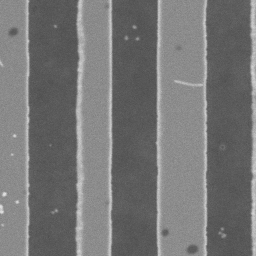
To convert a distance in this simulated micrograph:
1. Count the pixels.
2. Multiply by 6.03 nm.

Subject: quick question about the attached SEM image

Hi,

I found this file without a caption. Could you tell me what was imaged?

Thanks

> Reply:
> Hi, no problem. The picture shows lines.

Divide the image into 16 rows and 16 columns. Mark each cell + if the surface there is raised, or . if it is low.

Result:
++...++...+++...
++...++...+++...
++...++...+++...
++...++...+++...
++...++...+++...
++...++...+++...
++...++...+++...
++...++...+++...
++...++...+++...
++...++...+++...
++...++...+++...
++...++...+++...
++...++...+++...
++...++...+++...
++...++...+++...
++...++...+++...